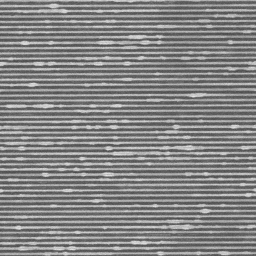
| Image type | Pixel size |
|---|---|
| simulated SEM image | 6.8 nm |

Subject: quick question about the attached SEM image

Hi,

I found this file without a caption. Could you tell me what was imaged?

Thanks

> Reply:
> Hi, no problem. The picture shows parallel lines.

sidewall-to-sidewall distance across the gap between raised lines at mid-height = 3.12 pixels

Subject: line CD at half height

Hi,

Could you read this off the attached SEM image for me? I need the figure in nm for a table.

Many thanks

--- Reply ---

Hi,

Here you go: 11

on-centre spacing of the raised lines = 35.8 nm